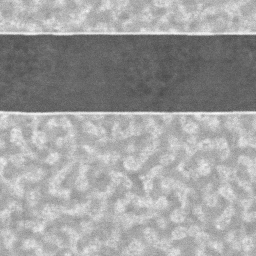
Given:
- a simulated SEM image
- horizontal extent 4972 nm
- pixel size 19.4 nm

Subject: one or a few lines or trenches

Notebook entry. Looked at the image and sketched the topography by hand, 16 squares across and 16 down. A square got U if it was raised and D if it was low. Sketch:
UUUUUUUUUUUUUUUU
UUUUUUUUUUUUUUUU
DDDDDDDDDDDDDDDD
DDDDDDDDDDDDDDDD
DDDDDDDDDDDDDDDD
DDDDDDDDDDDDDDDD
DDDDDDDDDDDDDDDD
UUUUUUUUUUUUUUUU
UUUUUUUUUUUUUUUU
UUUUUUUUUUUUUUUU
UUUUUUUUUUUUUUUU
UUUUUUUUUUUUUUUU
UUUUUUUUUUUUUUUU
UUUUUUUUUUUUUUUU
UUUUUUUUUUUUUUUU
UUUUUUUUUUUUUUUU